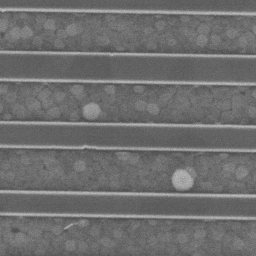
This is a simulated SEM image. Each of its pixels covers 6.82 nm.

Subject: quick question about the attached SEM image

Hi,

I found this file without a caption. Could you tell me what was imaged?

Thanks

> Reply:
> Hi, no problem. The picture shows one or a few lines or trenches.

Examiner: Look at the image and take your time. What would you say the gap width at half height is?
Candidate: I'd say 286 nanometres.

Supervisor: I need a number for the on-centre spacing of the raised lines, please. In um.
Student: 0.467